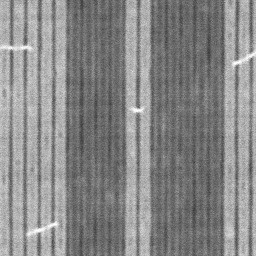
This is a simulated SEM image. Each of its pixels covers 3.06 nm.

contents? parallel lines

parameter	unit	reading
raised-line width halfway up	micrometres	0.0306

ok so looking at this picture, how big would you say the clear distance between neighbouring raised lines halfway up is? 13.8 nanometres